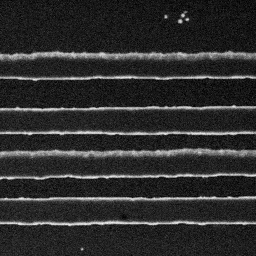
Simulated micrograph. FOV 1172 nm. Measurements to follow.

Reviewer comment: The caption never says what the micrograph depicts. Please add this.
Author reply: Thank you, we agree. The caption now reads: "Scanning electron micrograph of lines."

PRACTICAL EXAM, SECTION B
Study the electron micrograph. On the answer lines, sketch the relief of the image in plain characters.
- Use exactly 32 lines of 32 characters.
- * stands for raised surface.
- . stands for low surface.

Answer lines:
................................
................................
................................
................................
................................
................................
................................
********************************
********************************
********************************
................................
................................
................................
..................******.*******
********************************
********************************
********************************
................................
................................
********************************
********************************
********************************
................................
................................
................................
********************************
********************************
********************************
................................
................................
................................
................................